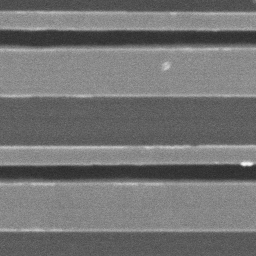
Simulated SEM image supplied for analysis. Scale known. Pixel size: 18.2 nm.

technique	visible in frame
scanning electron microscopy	lines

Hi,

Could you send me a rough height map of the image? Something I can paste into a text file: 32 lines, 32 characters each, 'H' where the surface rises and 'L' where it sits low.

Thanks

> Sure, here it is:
LLLLLLLLLLLLLLLLLLLLLLLLLLLLLLLL
LLLLLLLLLLLLLLLLLLLLLLLLLLLLLLLL
HHHHHHHHHHHHHHHHHHHHHHHHHHHHHHHH
HHHHHHHHHHHHHHHHHHHHHHHHHHHHHHHH
LLLLLLLLLLLLLLLLLLLLLLLLLLLLLLLL
LLLLLLLLLLLLLLLLLLLLLLLLLLLLLLLL
HHHHHHHHHHHHHHHHHHHHHHHHHHHHHHHH
HHHHHHHHHHHHHHHHHHHHHHHHHHHHHHHH
HHHHHHHHHHHHHHHHHHHHHHHHHHHHHHHH
HHHHHHHHHHHHHHHHHHHHHHHHHHHHHHHH
HHHHHHHHHHHHHHHHHHHHHHHHHHHHHHHH
HHHHHHHHHHHHHHHHHHHHHHHHHHHHHHHH
LLLLLLLLLLLLLLLLLLLLLLLLLLLLLLLL
LLLLLLLLLLLLLLLLLLLLLLLLLLLLLLLL
LLLLLLLLLLLLLLLLLLLLLLLLLLLLLLLL
LLLLLLLLLLLLLLLLLLLLLLLLLLLLLLLL
LLLLLLLLLLLLLLLLLLLLLLLLLLLLLLLL
LLLLLLLLLLLLLLLLLLLLLLLLLLLLLLLL
HHHHHHHHHHHHHHHHHHHHHHHHHHHHHHHH
HHHHHHHHHHHHHHHHHHHHHHHHHHHHHHHH
HHHHHHHHHHHHHHHLHHHLLLLLLLLLLLHH
LLLLLLLLLLLLLLLLLLLLLLLLLLLLLLLL
LLLLLLLLLLLLLLLLLLLLLLLLLLLLLLLL
HHHHHHHHHHHHHHHHHHHHHHHHHHHHHHHH
HHHHHHHHHHHHHHHHHHHHHHHHHHHHHHHH
HHHHHHHHHHHHHHHHHHHHHHHHHHHHHHHH
HHHHHHHHHHHHHHHHHHHHHHHHHHHHHHHH
HHHHHHHHHHHHHHHHHHHHHHHHHHHHHHHH
HHHHHHHHHHHHHHHHHHHHHHHHHHHHHHHH
LLLLLLLLLLLLLLLLLLLLLLLLLLLLLLLL
LLLLLLLLLLLLLLLLLLLLLLLLLLLLLLLL
LLLLLLLLLLLLLLLLLLLLLLLLLLLLLLLL